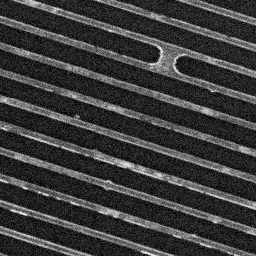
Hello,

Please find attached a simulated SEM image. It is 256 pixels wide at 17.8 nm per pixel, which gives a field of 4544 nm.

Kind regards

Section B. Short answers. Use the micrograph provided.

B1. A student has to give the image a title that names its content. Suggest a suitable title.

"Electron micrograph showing parallel lines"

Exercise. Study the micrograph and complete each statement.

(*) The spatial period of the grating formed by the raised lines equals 25.1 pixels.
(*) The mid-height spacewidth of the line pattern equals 0.336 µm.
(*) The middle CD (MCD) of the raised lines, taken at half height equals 5.96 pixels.